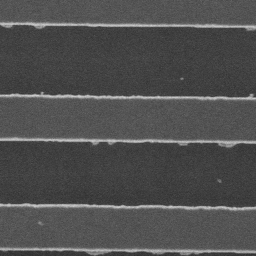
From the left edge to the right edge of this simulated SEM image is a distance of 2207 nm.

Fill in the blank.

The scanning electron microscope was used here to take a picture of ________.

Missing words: lines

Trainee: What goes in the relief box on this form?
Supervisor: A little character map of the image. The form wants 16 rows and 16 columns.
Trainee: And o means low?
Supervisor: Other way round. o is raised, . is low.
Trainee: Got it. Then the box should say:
oooooooooooooooo
oooooooooooooooo
................
................
................
................
oooooooooooooooo
oooooooooooooooo
oooooooooooooooo
................
................
................
................
oooooooooooooooo
oooooooooooooooo
oooooooooooooooo